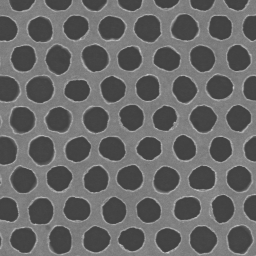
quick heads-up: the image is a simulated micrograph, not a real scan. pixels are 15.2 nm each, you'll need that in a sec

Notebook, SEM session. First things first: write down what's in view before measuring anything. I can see a regular array of holes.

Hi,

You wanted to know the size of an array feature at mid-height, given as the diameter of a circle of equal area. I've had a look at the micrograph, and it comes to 380 nanometres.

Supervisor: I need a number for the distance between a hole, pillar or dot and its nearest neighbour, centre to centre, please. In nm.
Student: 518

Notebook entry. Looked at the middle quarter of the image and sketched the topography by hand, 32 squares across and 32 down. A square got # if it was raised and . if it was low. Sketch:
.#####.....###.....####......###
.######..######..########...####
################################
##########...######....#####...#
#.....####.....###......####....
......###......###......###.....
.......##......###......###.....
......####.....###......####....
#.....####....#####....#####....
############.################..#
################..#######.######
######....####.....####.....####
.####......###......###.....####
.####......###......##......###.
.####......###......##......####
.####......####....####....#####
.#####....######..######..######
################################
###..#####...#######...#####...#
#.....###......####.....####....
#......##......###......###.....
.......##......###......###.....
#.....###......####.....####....
#.....####.....#####...######...
################################
################..#######.######
.#####....####.....#####....####
..###......##......####......###
..###......##.......##.......##.
..###......##.......##.......##.
.####......###.....####.....####
######....##############...#####